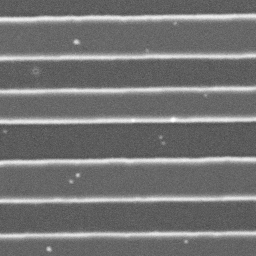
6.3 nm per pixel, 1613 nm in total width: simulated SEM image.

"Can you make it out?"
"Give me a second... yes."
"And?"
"lines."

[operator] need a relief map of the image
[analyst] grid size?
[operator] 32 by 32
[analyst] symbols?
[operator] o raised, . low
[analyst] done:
................................
................................
oooooooooooooooooooooooooooooooo
oooooooooooooooooooooooooooooooo
oooooooooooooooooooooooooooooooo
oooooooooooooooooooooooooooooooo
oooooooooooooooooooooooooooooooo
................................
................................
................................
................................
oooooooooooooooooooooooooooooooo
oooooooooooooooooooooooooooooooo
oooooooooooooooooooooooooooooooo
oooooooooooooooooooooooooooooooo
................................
................................
................................
................................
................................
oooooooooooooooooooooooooooooooo
oooooooooooooooooooooooooooooooo
oooooooooooooooooooooooooooooooo
oooooooooooooooooooooooooooooooo
oooooooooooooooooooooooooooooooo
................................
................................
................................
................................
oooooooooooooooooooooooooooooooo
oooooooooooooooooooooooooooooooo
oooooooooooooooooooooooooooooooo